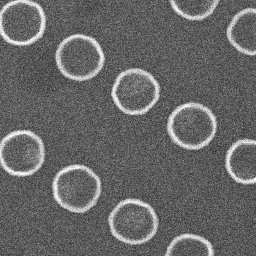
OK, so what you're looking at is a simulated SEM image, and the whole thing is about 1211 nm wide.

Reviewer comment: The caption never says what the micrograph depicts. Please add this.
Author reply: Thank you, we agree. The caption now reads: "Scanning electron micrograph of raised bodies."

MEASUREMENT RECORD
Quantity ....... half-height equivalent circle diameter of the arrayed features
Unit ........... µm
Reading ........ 0.208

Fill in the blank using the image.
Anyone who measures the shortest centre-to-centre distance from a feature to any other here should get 312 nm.